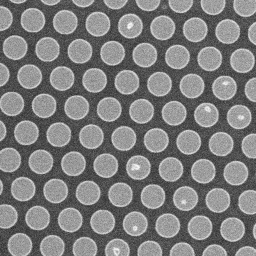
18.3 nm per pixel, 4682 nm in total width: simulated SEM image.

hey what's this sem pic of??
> an array of small figures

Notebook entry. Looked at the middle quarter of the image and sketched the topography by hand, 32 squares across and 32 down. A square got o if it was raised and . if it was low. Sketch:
...................oo.....oooo..
oo....ooo.......................
oo...ooooo....oooo....ooo.......
oo...ooooo...oooooo..ooooo....oo
oo...oooooo..oooooo..oooooo..ooo
oo...ooooo...oooooo..oooooo..ooo
......ooo....ooooo...ooooo...ooo
......................oooo....oo
.oooo......o....................
.ooooo...ooooo...oooo.....oo....
oooooo...ooooo...ooooo...ooooo..
oooooo..oooooo...ooooo...ooooo..
.ooooo...ooooo..oooooo...ooooo..
..ooo....oooo....ooooo...ooooo..
..................ooo.....oooo..
o.....oo........................
o...ooooo....oooo.....oo........
oo..oooooo..oooooo..oooooo...ooo
oo..oooooo..oooooo..oooooo..oooo
o...ooooo...oooooo..oooooo..oooo
.....oooo....oooo...oooooo..oooo
..............o......oooo....ooo
.ooo..........................oo
ooooo...ooooo....ooo......oo....
ooooo...ooooo...ooooo...ooooo...
ooooo..oooooo...ooooo...ooooo...
ooooo...ooooo...ooooo...oooooo..
.ooo....ooooo...ooooo...ooooo...
.................ooo.....oooo...
.....oo.........................
o...oooo....oooo.....ooo........
o..oooooo..oooooo...ooooo...oooo